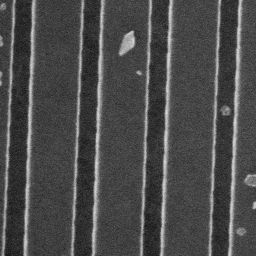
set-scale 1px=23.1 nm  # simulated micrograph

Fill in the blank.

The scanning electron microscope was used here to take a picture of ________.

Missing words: lines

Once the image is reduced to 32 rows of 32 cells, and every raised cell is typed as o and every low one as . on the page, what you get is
oo..oooooo...oooooo..ooooooo..oo
oo..oooooo...oooooo..oooooo...oo
oo..oooooo...oooooo..oooooo...oo
oo..oooooo...oooooo..oooooo...oo
oo..oooooo...oooooo..oooooo...oo
oo..oooooo...oooooo..oooooo...oo
oo..oooooo...oooooo..oooooo...oo
oo..oooooo...oooooo..oooooo...oo
o...oooooo...oooooo..oooooo...oo
o...oooooo..ooooooo..oooooo...oo
o...oooooo..ooooooo..oooooo...oo
o...oooooo..oooooo...oooooo...oo
o...oooooo..oooooo...oooooo...oo
o...oooooo..oooooo...oooooo..ooo
o...oooooo..oooooo...oooooo..ooo
o...oooooo..oooooo...oooooo..ooo
o...oooooo..oooooo...oooooo..ooo
o...oooooo..oooooo...oooooo..ooo
o...oooooo..oooooo...oooooo..ooo
o...oooooo..oooooo...oooooo..ooo
o...oooooo..oooooo...oooooo..ooo
o..ooooooo..oooooo...oooooo..ooo
o..ooooooo..oooooo...oooooo..ooo
o..oooooo...oooooo...oooooo..ooo
o..oooooo...oooooo..ooooooo..ooo
o..oooooo...oooooo..ooooooo..ooo
o..oooooo...oooooo..ooooooo..ooo
o..oooooo...oooooo..oooooo...ooo
o..oooooo...oooooo..oooooo...ooo
o..oooooo...oooooo..oooooo...ooo
o..oooooo...oooooo..oooooo...ooo
...oooooo...oooooo..oooooo...ooo